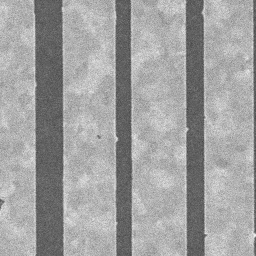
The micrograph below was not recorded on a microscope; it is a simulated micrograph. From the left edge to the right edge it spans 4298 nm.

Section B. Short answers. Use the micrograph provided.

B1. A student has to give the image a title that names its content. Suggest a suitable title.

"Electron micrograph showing one or a few lines or trenches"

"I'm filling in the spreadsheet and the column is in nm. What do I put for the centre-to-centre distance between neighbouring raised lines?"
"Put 1170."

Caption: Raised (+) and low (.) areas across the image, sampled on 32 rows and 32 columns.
++++....++++++...+++......+++++.
++++....++++++..+++++++..+++++++
++++....++++++..+++++++...++++++
++++....++++++..+++++++...++++++
++++....++++++..+++++++...++++++
++++....++++++..+++++++...++++++
++++....++++++..+++++++...++++++
++++....++++++..+++++++...++++++
++++....++++++..+++++++...++++++
++++....+++.++..+++++++...++++++
++++....++++++..+++++++...++++++
++++....++++++...++++++...++++++
++++....++++++...++++++...++++++
++++....++++++...++++++...++++++
++++....++++++...++++++...++++++
++++....++++++...++++++...++++++
++++....++++.+...++++++...++++++
++++....++++.++..++++++...++++++
++++....++++++...++++++...++++++
++++....++++++...++++++...++++++
++++....++++++...++++++...++++++
++++....++++++...++++++...++++++
++++....++++++...++++++...++++++
++++....++++++...++++++...++++++
++++....++++++...++++++...++++++
++++....++++++...++++++...++++++
++++....++++++...++++++...++++++
++++....++++++...++++++...++++++
++++....++++++...++++++...++++++
++++....++++++...++++++...++++++
++++....++++++...++++++...++++++
++++....++++++...++++++...++++++